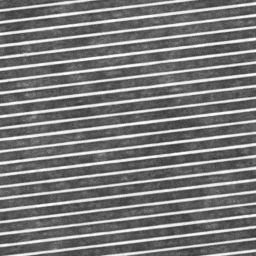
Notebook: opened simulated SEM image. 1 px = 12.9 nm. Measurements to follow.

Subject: parallel lines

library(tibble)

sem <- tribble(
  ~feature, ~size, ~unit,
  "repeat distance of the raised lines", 150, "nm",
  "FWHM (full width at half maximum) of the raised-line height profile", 25.6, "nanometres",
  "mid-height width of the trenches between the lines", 128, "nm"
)